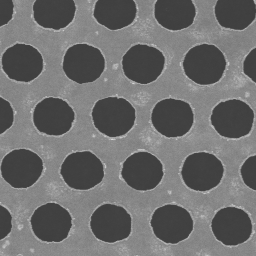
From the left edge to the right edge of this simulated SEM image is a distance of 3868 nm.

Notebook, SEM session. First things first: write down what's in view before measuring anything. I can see a regular array of holes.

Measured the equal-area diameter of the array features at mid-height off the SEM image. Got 611 nm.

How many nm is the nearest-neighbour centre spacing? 902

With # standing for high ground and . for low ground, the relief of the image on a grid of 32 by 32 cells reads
..##.....###.....##.....###.....
..##.....###.....##.....###.....
.###.....###.....###....###.....
######..#####..######..#####...#
################################
##.#############################
#....###.....###....###.....###.
.....###.....##......##.....###.
.....###.....##.....###.....##..
#....###....####....###.....###.
#########################.######
################################
.####...#####...####..#######.##
.###.....###.....##.....###....#
..##.....##......##.....##......
..##.....###.....##.....##......
#####...#####...####...####....#
################################
################################
#....####...####...#####...####.
.....###.....##.....###.....##..
.....###.....##.....###.....##..
#....###.....###....###.....##..
##.######..######..#####...####.
################################
######.######.##################
.###.....###....###.....###....#
.###.....##.....###.....###....#
.###.....##.....###.....##......
.####...####....####....###....#
############################..##
################################